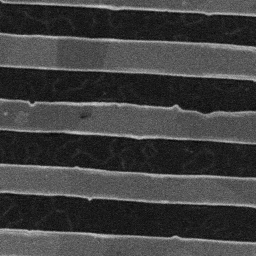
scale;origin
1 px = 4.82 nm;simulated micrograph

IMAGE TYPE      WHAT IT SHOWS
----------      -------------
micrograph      one or a few lines or trenches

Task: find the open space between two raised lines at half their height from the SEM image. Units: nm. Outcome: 162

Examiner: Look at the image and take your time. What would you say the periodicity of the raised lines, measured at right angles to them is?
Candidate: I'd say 310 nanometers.